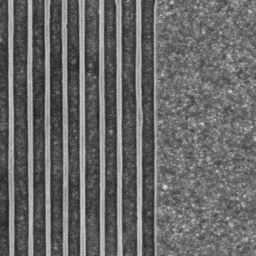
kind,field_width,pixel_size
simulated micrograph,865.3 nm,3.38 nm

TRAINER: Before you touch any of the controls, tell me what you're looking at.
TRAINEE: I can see parallel lines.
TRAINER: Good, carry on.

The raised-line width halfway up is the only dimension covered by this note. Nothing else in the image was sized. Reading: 0.0135 microns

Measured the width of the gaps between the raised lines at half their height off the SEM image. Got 0.0465 micrometres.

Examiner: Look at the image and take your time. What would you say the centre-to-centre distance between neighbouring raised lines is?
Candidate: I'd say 61.7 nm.